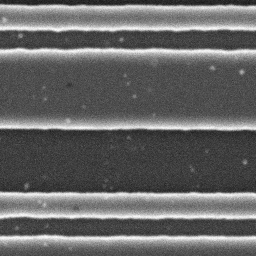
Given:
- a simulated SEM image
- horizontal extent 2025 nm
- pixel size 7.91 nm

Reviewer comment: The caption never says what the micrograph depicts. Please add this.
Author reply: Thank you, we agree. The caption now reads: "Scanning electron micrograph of lines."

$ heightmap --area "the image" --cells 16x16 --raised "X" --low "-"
XXXXXXXXXXXXXXXX
XXXXXXXXXXXXXXXX
XXXXXXXXXXXXXXXX
XXXXXXXXXXXXXXXX
XXXXXXXXXXXXXXXX
XXXXXXXXXXXXXXXX
XXXXXXXXXXXXXXXX
XXXXXXXXXXXXXXXX
----------------
----------------
----------------
----------------
XXXXXXXXXXXXXXXX
XXXXXXXXXXXXXXXX
XXXXXXXXXXXXXXXX
XXXXXXXXXXXXXXXX